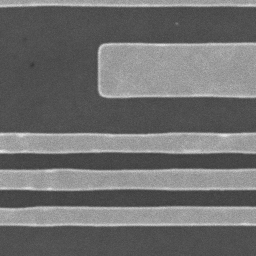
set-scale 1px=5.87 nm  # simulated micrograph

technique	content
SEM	wiring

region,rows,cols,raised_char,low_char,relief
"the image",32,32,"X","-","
XXXXXXXXXXXXXXXXXXXXXXXXXXXXXXXX
--------------------------------
--------------------------------
--------------------------------
--------------------------------
-------------XXXXX--------XXXXXX
------------XXXXXXXXXXXXXXXXXXXX
------------XXXXXXXXXXXXXXXXXXXX
------------XXXXXXXXXXXXXXXXXXXX
------------XXXXXXXXXXXXXXXXXXXX
------------XXXXXXXXXXXXXXXXXXXX
------------XXXXXXXXXXXXXXXXXXXX
--------------------------------
--------------------------------
--------------------------------
--------------------------------
--------------------------------
XXXXXXXXXXXXXXXXXXXXXXXXXXXXXXXX
XXXXXXXXXXXXXXXXXXXXXXXXXXXXXXXX
--------------------------------
--------------------------------
XXXXXXXXXXXXXXXXXXXXXXXXXXXXXXXX
XXXXXXXXXXXXXXXXXXXXXXXXXXXXXXXX
XXXXXXXXXXXXXXXXXXXXXXXXXXXXXXXX
--------------------------------
--------------------------------
XXXXXXXXXXXXXXXXXXXXXXXXXXXXXXXX
XXXXXXXXXXXXXXXXXXXXXXXXXXXXXXXX
--------------------------------
--------------------------------
--------------------------------
--------------------------------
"